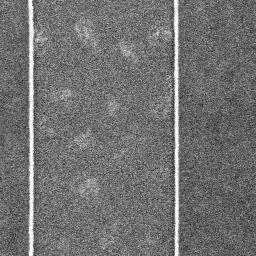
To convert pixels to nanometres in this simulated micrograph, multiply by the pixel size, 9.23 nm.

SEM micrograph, one or a few lines or trenches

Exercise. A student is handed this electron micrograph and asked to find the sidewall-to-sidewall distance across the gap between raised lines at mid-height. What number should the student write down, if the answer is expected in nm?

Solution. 1340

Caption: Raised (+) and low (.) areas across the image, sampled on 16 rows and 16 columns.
++.........+++++
++.........+++++
++.........+++++
++.........+++++
++.........+++++
++.........+++++
++.........+++++
++.........+++++
++.........+++++
++.........+++++
++.........+++++
++.........+++++
++.........+++++
++.........+++++
++.........+++++
++.........+++++